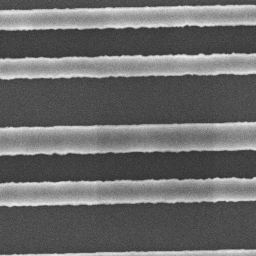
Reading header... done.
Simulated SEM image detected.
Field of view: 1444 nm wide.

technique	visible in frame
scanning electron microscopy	lines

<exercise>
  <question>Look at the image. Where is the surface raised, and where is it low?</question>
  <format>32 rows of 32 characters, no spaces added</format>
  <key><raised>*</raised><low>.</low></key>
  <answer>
................................
********************************
********************************
*************...................
................................
................................
................................
********************************
********************************
*******************.*...........
................................
................................
................................
................................
................................
.....................***********
********************************
********************************
********************************
................................
................................
................................
....................************
********************************
********************************
**************..................
................................
................................
................................
................................
................................
................*.**************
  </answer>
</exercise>